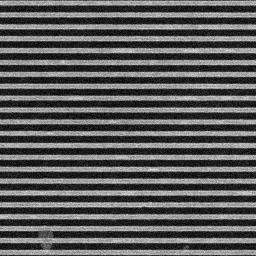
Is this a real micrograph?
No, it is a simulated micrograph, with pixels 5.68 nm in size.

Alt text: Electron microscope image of parallel lines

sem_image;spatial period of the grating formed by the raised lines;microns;0.0674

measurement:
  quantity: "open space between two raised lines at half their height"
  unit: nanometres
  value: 44.7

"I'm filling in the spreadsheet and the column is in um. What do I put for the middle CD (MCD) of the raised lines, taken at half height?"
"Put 0.0248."